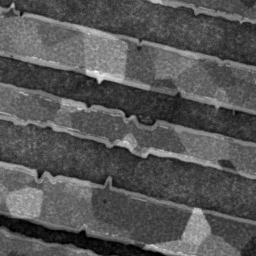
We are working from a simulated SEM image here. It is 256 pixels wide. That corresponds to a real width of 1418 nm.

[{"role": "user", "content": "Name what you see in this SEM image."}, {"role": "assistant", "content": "one or a few lines or trenches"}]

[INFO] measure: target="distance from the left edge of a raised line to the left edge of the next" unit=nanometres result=409